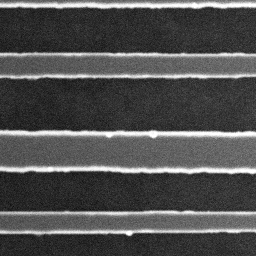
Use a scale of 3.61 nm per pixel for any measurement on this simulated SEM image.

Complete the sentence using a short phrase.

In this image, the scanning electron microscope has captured lines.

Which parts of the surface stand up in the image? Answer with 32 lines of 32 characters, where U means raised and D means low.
UUUUUUUUUUUUUUUUUUUUUUUUUUUUUUUU
DDDDDDDDDDDDDDDDDDDDDDDDDDDDDDDD
DDDDDDDDDDDDDDDDDDDDDDDDDDDDDDDD
DDDDDDDDDDDDDDDDDDDDDDDDDDDDDDDD
DDDDDDDDDDDDDDDDDDDDDDDDDDDDDDDD
DDDDDDDDDDDDDDDDDDDDDDDDDDDDDDDD
DDDDDDDDDDDDDDDDDDDDDDDDDDDDDDDD
UUUUUUUUUUUUUUUUUUUUUUUUUUUUUUUU
UUUUUUUUUUUUUUUUUUUUUUUUUUUUUUUU
UUUUUUUUUUUUUUUUUUUUUUUUUUUUUUUU
DDDDDDDDDDDDDDDDDDDDDDDDDDDDDDDD
DDDDDDDDDDDDDDDDDDDDDDDDDDDDDDDD
DDDDDDDDDDDDDDDDDDDDDDDDDDDDDDDD
DDDDDDDDDDDDDDDDDDDDDDDDDDDDDDDD
DDDDDDDDDDDDDDDDDDDDDDDDDDDDDDDD
DDDDDDDDDDDDDDDDDDDDDDDDDDDDDDDD
UDDDDDDDDDDDDDDDDDDUDDDDDDDDDDDD
UUUUUUUUUUUUUUUUUUUUUUUUUUUUUUUU
UUUUUUUUUUUUUUUUUUUUUUUUUUUUUUUU
UUUUUUUUUUUUUUUUUUUUUUUUUUUUUUUU
UUUUUUUUUUUUUUUUUUUUUUUUUUUUUUUU
DDDDDDDDDDDDDDDDDDUDDDDUDDDDUUDU
DDDDDDDDDDDDDDDDDDDDDDDDDDDDDDDD
DDDDDDDDDDDDDDDDDDDDDDDDDDDDDDDD
DDDDDDDDDDDDDDDDDDDDDDDDDDDDDDDD
DDDDDDDDDDDDDDDDDDDDDDDDDDDDDDDD
DDDDDDDDDDDDDDDDDDUUUUDUUDDDDDDD
UUUUUUUUUUUUUUUUUUUUUUUUUUUUUUUU
UUUUUUUUUUUUUUUUUUUUUUUUUUUUUUUU
DDDDDDDDDDDDDDDDDDDDDDDDDDDDDDDD
DDDDDDDDDDDDDDDDDDDDDDDDDDDDDDDD
DDDDDDDDDDDDDDDDDDDDDDDDDDDDDDDD